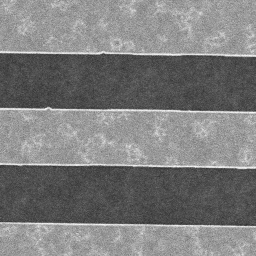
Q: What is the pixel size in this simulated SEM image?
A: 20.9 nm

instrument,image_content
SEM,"one or a few lines or trenches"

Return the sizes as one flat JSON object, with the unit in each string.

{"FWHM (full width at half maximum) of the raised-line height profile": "1160 nm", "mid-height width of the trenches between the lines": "1200 nm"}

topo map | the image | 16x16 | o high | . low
oooooooooooooooo
oooooooooooooooo
oooooooooooooooo
................
................
................
................
oooooooooooooooo
oooooooooooooooo
oooooooooooooooo
................
................
................
................
oooooooooooooooo
oooooooooooooooo